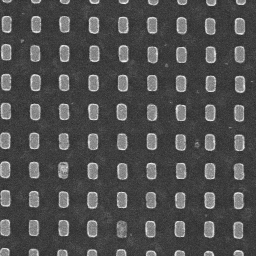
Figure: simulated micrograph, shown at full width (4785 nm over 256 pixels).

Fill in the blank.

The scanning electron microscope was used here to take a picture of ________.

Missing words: a regular array of raised bodies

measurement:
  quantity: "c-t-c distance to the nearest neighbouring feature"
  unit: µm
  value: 0.536